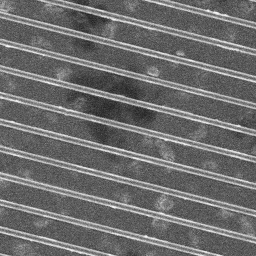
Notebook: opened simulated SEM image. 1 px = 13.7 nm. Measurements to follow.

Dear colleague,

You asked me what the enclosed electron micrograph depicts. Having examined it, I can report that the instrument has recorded parallel lines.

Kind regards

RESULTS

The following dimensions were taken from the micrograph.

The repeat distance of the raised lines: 357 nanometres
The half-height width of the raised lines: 74.8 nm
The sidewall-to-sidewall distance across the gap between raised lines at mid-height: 279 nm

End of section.